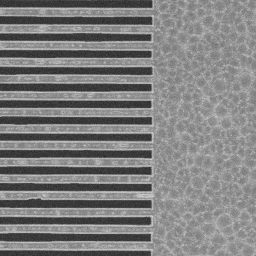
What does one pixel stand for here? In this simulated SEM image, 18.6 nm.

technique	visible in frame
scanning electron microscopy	parallel lines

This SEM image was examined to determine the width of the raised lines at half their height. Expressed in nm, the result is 142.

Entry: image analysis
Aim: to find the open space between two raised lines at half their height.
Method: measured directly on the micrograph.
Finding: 174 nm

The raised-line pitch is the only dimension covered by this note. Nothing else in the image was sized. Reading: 310 nm